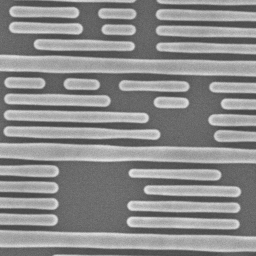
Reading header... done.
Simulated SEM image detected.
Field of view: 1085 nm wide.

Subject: groups of lines, slits or small figures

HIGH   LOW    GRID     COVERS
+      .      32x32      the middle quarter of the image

++++++++++++++++++++++++++++++++
++++++++++++++++++++++++++++++++
.........................+++++++
................................
+++++++++.....++++++++++++++++..
+++++++++.....+++++++++++++++++.
..............+++++++++++++++++.
................................
+++++++++++............++++.....
++++++++++++...........++++++++.
.......................++++++++.
................................
+++++++++++++++++++++...........
+++++++++++++++++++++...........
..................++............
................................
++++++++++++++......+++.........
++++++++++++++++++++++++........
....++++++++......++++++........
................................
++++++++++++....................
++++++++++++++++++++++++++++++++
++++++++++++++++++++++++++++++++
++++++++++++++++++++++++++++++++
.............................+++
................................
.................++.............
................++++++++++++++++
.......................+++++++++
................................
................................
....................++++++++++++